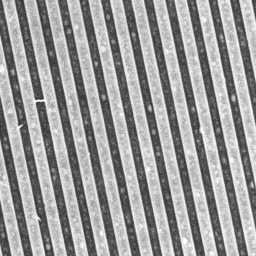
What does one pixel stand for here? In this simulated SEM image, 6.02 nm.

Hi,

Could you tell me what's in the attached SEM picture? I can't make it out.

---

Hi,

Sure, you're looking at parallel lines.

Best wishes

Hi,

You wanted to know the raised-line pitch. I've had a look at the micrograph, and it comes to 0.127 um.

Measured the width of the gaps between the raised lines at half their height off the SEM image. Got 56.7 nm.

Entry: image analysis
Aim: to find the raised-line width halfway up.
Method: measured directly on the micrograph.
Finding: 67.9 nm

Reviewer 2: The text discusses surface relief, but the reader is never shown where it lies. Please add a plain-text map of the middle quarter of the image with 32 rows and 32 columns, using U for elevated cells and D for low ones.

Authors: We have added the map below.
UUDDUUUDDUUUDDDUUUDDUUUDDDUUUDDU
UUDDUUUDDDUUUDDUUUDDUUUDDDUUUDDU
UUDDDUUDDDUUUDDUUUDDDUUUDDUUUDDU
UUDDDUUUDDUUUDDDUUDDDUUUDDUUUDDD
UUUDDUUUDDUUUDDDUUUDDUUUDDDUUDDD
UUUDDUUUDDDUUDDDUUUDDUUUDDDUUUDD
UUUDDUUUDDDUUUDDUUUDDUUUDDDUUUDD
UUUDDDUUDDDUUUDDUUUDDDUUUDDUUUDD
UUUDDDUUUDDUUUDDDUUDDDUUUDDUUUDD
DUUUDDUUUDDUUUDDDUUUDDUUUDDDUUDD
DUUUDDUUUDDDUUUDDUUUDDUUUDDDUUUD
DUUUDDUUUDDDUUUDDUUUDDDUUUDDUUUD
DUUUDDDUUDDDUUUDDUUUDDDUUUDDUUUD
DUUUDDDUUUDDUUUDDDUUDDDUUUDDUUUD
DDUUUDDUUUDDUUUDDDUUUDDUUUDDDUUD
DDUUUDDUUUDDDUUUDDUUUDDUUUDDDUUU
DDUUUDDUUUDDDUUUDDUUUDDDUUUDDUUU
DDUUUDDDUUDDDUUUDDUUUDDDUUUDDUUU
DDUUUDDDUUUDDUUUDDDUUDDDUUUDDUUU
DDDUUUDDUUUDDUUUDDDUUUDDUUUDDDUU
DDDUUUDDUUUDDDUUUDDUUUDDUUUDDDUU
UDDUUUDDDUUDDDUUUDDUUUDDDUUUDDUU
UDDUUUDDDUUDDDUUUDDUUUDDDUUUDDUU
UDDDUUDDDUUUDDUUUDDDUUUDDUUUDDUU
UDDDUUUDDUUUDDUUUDDDUUUDDUUUDDDU
UDDDUUUDDUUUDDDUUUDDUUUDDUUUDDDU
UUDDUUUDDDUUDDDUUUDDUUUDDDUUUDDU
UUDDUUUDDDUUUDDUUUDDDUUDDDUUUDDU
UUDDUUUDDDUUUDDUUUDDDUUDDDUUUDDD
UUDDDUUUDDUUUDDDUUDDDUUUDDUUUDDD
UUDDDUUUDDUUUDDDUUUDDUUUDDUUUDDD
UUUDDUUUDDDUUDDDUUUDDUUUDDDUUUDD